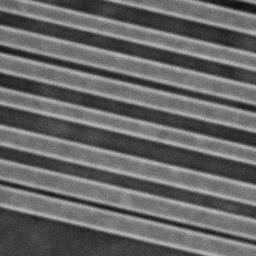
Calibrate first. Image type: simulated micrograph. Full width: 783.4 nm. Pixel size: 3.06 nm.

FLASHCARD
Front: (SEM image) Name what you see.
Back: parallel lines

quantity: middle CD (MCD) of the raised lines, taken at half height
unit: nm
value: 51.7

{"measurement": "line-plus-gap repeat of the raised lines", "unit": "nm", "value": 97.4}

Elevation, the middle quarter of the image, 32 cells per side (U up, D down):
DDDDDDDDUUUUUUUUUUUUUUUUUUDDDDDD
DDDDDDDDDDDDUUUUUUUUUUUUUUUUUUDD
UUUUUDDDDDDDDDDDUUUUUUUUUUUUUUUU
UUUUUUUUUDDDDDDDDDDDDUUUUUUUUUUU
UUUUUUUUUUUUUDDDDDDDDDDDDUUUUUUU
UUUUUUUUUUUUUUUUUDDDDDDDDDDDDUUU
DDDDUUUUUUUUUUUUUUUUUDDDDDDDDDDD
DDDDDDDDDUUUUUUUUUUUUUUUUUDDDDDD
DDDDDDDDDDDDDUUUUUUUUUUUUUUUUUUD
DDDDDDDDDDDDDDDDDUUUUUUUUUUUUUUU
UUUDDDDDDDDDDDDDDDDDDUUUUUUUUUUU
UUUUUUUDDDDDDDDDDDDDDDDDDDUUUUUU
UUUUUUUUUUUDDDDDDDDDDDDDDDDDDDUU
UUUUUUUUUUUUUUUDDDDDDDDDDDDDDDDD
DDDDUUUUUUUUUUUUUUUUDDDDDDDDDDDD
DDDDDDDDDUUUUUUUUUUUUUUUDDDDDDDD
DDDDDDDDDDDDDUUUUUUUUUUUUUUUDDDD
DDDDDDDDDDDDDDDDDUUUUUUUUUUUUUUU
DDDDDDDDDDDDDDDDDDDDDUUUUUUUUUUU
UDDDDDDDDDDDDDDDDDDDDDDDDDUUUUUU
UUUUUDDDDDDDDDDDDDDDDDDDDDDDDDUU
UUUUUUUUUUDDDDDDDDDDDDDDDDDDDDDD
UUUUUUUUUUUUUUDDDDDDDDDDDDDDDDDD
UUUUUUUUUUUUUUUUUUDDDDDDDDDDDDDD
DDDUUUUUUUUUUUUUUUUUUUDDDDDDDDDD
DDDDDDDUUUUUUUUUUUUUUUUUUUDDDDDD
DDDDDDDDDDDDUUUUUUUUUUUUUUUUUUUD
DDDDDDDDDDDDDDDDUUUUUUUUUUUUUUUU
UUDDDDDDDDDDDDDDDDDDUUUUUUUUUUUU
UUUUUUUDDDDDDDDDDDDDDDDDUUUUUUUU
UUUUUUUUUUUDDDDDDDDDDDDDDDDDDUUU
UUUUUUUUUUUUUUUDDDDDDDDDDDDDDDDD